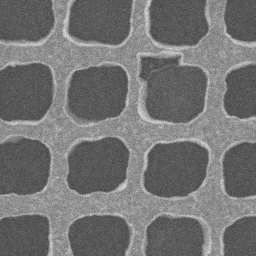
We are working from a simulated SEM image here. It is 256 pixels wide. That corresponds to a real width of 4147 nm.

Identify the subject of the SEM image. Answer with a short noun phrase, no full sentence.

holes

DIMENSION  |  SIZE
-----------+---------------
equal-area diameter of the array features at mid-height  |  1.01 µm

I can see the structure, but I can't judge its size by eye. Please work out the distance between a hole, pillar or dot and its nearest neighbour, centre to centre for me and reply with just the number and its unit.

1190 nm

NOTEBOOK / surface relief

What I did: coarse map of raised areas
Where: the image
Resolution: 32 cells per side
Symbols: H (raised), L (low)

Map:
LLLLLLLHHLLLLLLLLHHLLLLLLLHHLLLL
LLLLLLLHHLLLLLLLHHHLLLLLLLHHLLLL
LLLLLLLHHLLLLLLLHHHLLLLLLLHHLLLL
LLLLLLLHHLLLLLLLHHHLLLLLLLHHLLLL
LLLLLLHHHLLLLLLLHHHLLLLLLLHHHLLL
HHHHHHHHHHHHHLLHHHHHLLLLLHHHHHHH
HHHHHHHHHHHHHHHHHHHHHHHHHHHHHHHH
HHHHHHHHHHHHHHHHHHLLLLHHHHHHHHHH
HLLLLLHHHHHLLLLHHLLLLLLLLHHHHHLL
LLLLLLHHHLLLLLLLHLLLLLLLLLHHLLLL
LLLLLLLHHLLLLLLLHHLLLLLLLLHHLLLL
LLLLLLLHLLLLLLLLHHLLLLLLLLHHLLLL
LLLLLLLHLLLLLLLLHHLLLLLLLLHHLLLL
LLLLLLHHLLLLLLLLHHLLLLLLLLHHLLLL
LLLLLLHHHLLLLLLHHHHLLLLLLHHHHLLL
HHHHHHHHHHLHHHHHHHHHHHHHHHHHHHHH
HHHHHHHHHHHHHHHHHHHHHHHHHHHHHHHH
HLLLLHHHHHHHLLLHHHHHHHHHHHHHHHHH
LLLLLLHHHLLLLLLLHHHLLLLLLLHHHLLL
LLLLLLHHLLLLLLLLHHLLLLLLLLHHLLLL
LLLLLLHHLLLLLLLLHHLLLLLLLLHHLLLL
LLLLLLHHHLLLLLLLHHLLLLLLLLHHLLLL
LLLLLLHHLLLLLLLLHHLLLLLLLLHHLLLL
LLLLLHHHHLLLLLLHHHLLLLLLLHHHLLLL
HHHHHHHHHHHHHHHHHHHHLLLHHHHHHLLL
HHHHHHHHHHHHHHHHHHHHHHHHHHHHHHHH
HHHHHHHHHHHHHHHHHHHHHHHHHHHHHHHH
LLLLLLHHHHLLLLLLHHHLLLLLLHHHHHLL
LLLLLLHHHLLLLLLLHHLLLLLLLLHHLLLL
LLLLLLHHHLLLLLLLHHLLLLLLLLHHLLLL
LLLLLLHHHLLLLLLLHHLLLLLLLLHHLLLL
LLLLLLHHHLLLLLLLHHLLLLLLLHHHLLLL